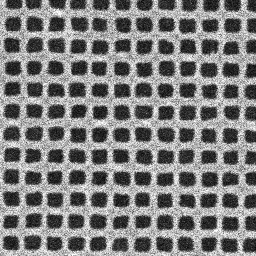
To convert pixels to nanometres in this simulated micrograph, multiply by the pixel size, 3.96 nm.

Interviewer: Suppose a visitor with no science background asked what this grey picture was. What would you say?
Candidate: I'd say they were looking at a regular array of holes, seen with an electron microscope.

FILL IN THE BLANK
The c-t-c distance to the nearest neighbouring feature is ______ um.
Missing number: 0.084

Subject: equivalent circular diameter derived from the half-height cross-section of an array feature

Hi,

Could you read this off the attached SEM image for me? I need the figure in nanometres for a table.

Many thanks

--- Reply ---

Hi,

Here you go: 63.7